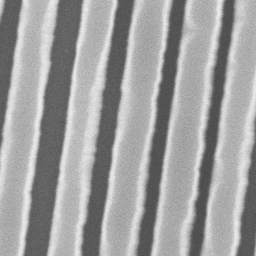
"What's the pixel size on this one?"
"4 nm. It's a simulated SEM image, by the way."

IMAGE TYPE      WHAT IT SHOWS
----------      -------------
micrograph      lines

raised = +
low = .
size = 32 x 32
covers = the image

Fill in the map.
...++++...+++++..++++..+++++..++
...++++...++++...++++..+++++..++
...++++...++++..+++++..+++++.+++
..++++....++++..+++++..++++..+++
..++++....++++..+++++..++++..+++
..++++....++++..+++++..++++..+++
..++++....+++...++++...++++..+++
..++++...++++...++++..+++++..+++
..++++...++++...++++..+++++.++++
..++++...++++...++++..++++..++++
.+++++...++++..+++++..++++..++++
.++++....++++..+++++..++++..++++
.++++....+++...+++++..++++..++++
.++++....+++...+++++.+++++..++++
.++++....+++...++++..+++++..++++
.++++...++++...++++..+++++.++++.
.++++...++++...++++..+++++.++++.
+++++...++++..+++++..++++..++++.
+++++...++++..+++++..++++..++++.
++++....+++...+++++..++++..++++.
++++....+++...++++..+++++..++++.
++++....+++...++++..+++++..++++.
++++...++++...++++..+++++..++++.
++++...++++...++++..+++++.+++++.
++++...++++..+++++..+++++.++++..
++++...++++..+++++..++++..++++..
+++....++++..+++++..++++..++++..
+++....++++..++++...++++..++++..
+++....+++...++++..+++++..++++..
+++...++++...++++..++++...++++..
+++...++++...++++..++++...++++..
+++...++++...++++..++++..++++...